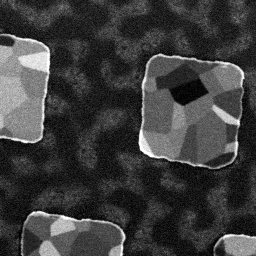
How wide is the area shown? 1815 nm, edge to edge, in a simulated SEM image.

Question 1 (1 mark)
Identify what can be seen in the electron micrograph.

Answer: raised bodies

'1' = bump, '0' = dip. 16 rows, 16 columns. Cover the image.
0000000000000000
0000000000000000
1100000000000000
1110000000100000
1110000001111110
1110000001111110
1110000001111110
1110000001111110
1110000001111110
0000000001111110
0000000000000000
0000000000000000
0000000000000000
0011000000000000
0111111100000000
0111111100000111